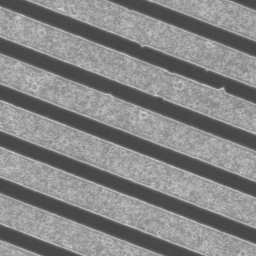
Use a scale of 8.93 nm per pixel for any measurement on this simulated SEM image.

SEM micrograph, parallel lines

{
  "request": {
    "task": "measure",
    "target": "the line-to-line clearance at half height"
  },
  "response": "108 nanometers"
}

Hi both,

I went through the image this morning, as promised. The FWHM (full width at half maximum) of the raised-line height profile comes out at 0.282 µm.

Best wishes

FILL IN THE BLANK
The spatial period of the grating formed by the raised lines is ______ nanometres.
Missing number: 390